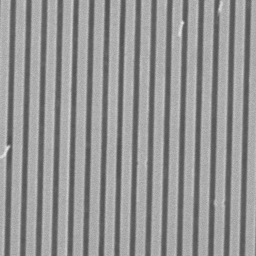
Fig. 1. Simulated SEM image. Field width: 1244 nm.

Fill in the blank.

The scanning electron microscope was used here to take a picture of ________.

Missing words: parallel lines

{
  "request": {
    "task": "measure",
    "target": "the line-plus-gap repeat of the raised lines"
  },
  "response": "76.1 nm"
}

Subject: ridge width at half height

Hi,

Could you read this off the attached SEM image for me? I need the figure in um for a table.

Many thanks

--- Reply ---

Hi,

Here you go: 0.0468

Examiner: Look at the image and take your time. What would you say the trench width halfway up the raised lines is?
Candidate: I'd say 29.8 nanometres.